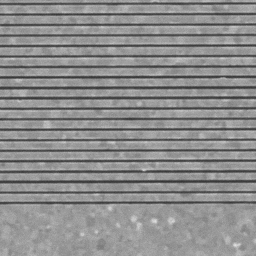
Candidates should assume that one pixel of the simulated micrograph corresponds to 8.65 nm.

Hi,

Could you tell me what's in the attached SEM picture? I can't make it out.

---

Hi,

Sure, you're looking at parallel lines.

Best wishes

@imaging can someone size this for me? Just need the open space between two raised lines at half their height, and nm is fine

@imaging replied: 26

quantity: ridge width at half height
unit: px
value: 7.87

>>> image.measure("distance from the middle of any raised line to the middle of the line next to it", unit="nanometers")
90.6